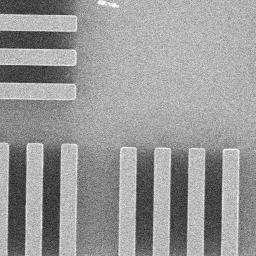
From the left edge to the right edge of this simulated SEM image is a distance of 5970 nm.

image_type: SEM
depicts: groups of lines, slits or small figures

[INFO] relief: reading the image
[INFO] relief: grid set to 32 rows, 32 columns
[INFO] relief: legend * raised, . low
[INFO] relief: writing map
................................
................................
**********......................
**********......................
................................
................................
*********.......................
*********.......................
................................
................................
*********.......................
*********.......................
................................
................................
................................
................................
................................
................................
*..**...**.....*................
*..**...**.....**..**...**..**..
*..**...**.....**..**...**..**..
*..**...**.....**..**...**..**..
*..**...**.....**..**...**..**..
*..**...**.....**..**...**..**..
*..**...**.....**..**...**..**..
*..**...**.....**..**..**...**..
*..**...**.....**..**..**...**..
*..**...*......**..**..**...**..
*..**..**......**..**..**...**..
*..**..**......**..**..**...**..
*..**..**......**..**..**...**..
*..**..**......**..**..**...**..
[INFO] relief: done